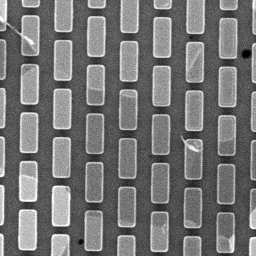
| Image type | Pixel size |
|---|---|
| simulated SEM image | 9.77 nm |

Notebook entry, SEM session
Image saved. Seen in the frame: groups of lines, slits or small figures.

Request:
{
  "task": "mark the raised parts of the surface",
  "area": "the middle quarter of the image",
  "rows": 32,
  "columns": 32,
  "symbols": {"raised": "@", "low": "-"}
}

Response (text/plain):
@@----@@@@----@@@@-------------@
@@----@@@@----@@@@----@@@@@----@
@@----@@@@----@@@@----@@@@@----@
@@----@@@@----@@@@----@@@@@----@
------@@@@------------@@@@------
------@@@@------------@@@@------
@-----@@@@------------@@@@------
@@----@@@@----@@@@----@@@@-----@
@@----@@@@----@@@@----@@@@-----@
@@----@@@@----@@@@----@@@@-----@
@@------------@@@@-------------@
@@------------@@@@-------------@
@@------------@@@@-------------@
@@----@@@@----@@@@----@@@@-----@
@@----@@@@----@@@@----@@@@-----@
@@----@@@@----@@@@----@@@@-----@
------@@@@------------@@@@-----@
------@@@@------------@@@@------
@-----@@@@------------@@@@------
@@----@@@@----@@@@----@@@@----@@
@-----@@@@----@@@@----@@@@----@@
@-----@@@@----@@@@----@@@@----@@
@-------------@@@@-----@@@----@@
@-------------@@@@------------@@
@-------------@@@@------------@@
@-----@@@@----@@@@----@@@@----@@
@-----@@@@----@@@@----@@@@----@@
@-----@@@@----@@@@----@@@@----@@
------@@@@------------@@@@-----@
------@@@@------------@@@@------
------@@@@------------@@@@------
@-----@@@@----@@@@----@@@@----@@